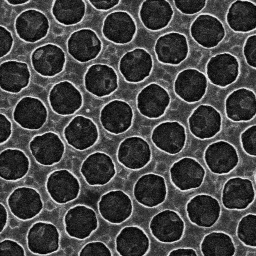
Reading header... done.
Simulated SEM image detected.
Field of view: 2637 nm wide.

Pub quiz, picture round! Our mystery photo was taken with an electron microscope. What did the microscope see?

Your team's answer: a regular array of holes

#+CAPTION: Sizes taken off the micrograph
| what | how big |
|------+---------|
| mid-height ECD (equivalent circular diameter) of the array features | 0.344 µm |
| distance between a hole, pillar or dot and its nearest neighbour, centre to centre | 394 nm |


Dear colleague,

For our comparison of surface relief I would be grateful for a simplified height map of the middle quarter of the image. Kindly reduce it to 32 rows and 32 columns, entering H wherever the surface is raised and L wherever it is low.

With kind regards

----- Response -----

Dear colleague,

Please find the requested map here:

HHHHHHHLLLLHHHLLLLLLLLHHHHHHHHHH
HHHHHHLLLLLLHHLLLLLLLLHHHHHHHHLL
HHHHHLLLLLLLLHLLLLLLLHHHHHHHHLLL
HHHHHLLLLLLLLHHLLLLLHHHHHHHHLLLL
LHHHHLLLLLLLLHHHLLLHHHHHHHHHLLLL
LLLHHLLLLLLLLHHHHHHHHLLLHHHLLLLL
LLLHHHLLLLLLLHHHHHHLLLLLLHHHLLLL
LLLLHHHLLLLLHHHHHHHLLLLLLLHHLLLL
LLLLLHHHHHHHHHHHHHLLLLLLLLLHHLLL
LLLLLHHHHHHLLLLHHHLLLLLLLLLHHHHL
LLLLHHHHHHLLLLLLHHLLLLLLLLHHHHHH
LLLLHHHHHLLLLLLLLHHLLLLLLHHHHHHH
LLHHHHHHHLLLLLLLLHHLLLLLLHHHHHHH
HHLLLLHHHLLLLLLLLHHHHLLHHHHHHHHL
HLLLLLLHHLLLLLLLLHHHHHHHHLLLHHHL
HLLLLLLLHHLLLLLLLHHHHHHLLLLLLLHL
LLLLLLLLHHHLLLLLHHHHHHLLLLLLLLHL
LLLLLLLLLHHHHLHHHHHHHHLLLLLLLLHH
LLLLLLLLLHHHHHHHLLLLHHLLLLLLLLHH
HLLLLLLLHHHHHHLLLLLLLHLLLLLLLLHH
HHLLLLLHHHHHHHLLLLLLLHHLLLLLLLHH
HHHHLHHHHHHHHLLLLLLLLLHHLLLLLHHH
HHHHHHHLLLLHHLLLLLLLLLHHHHHLHHHH
HHHHHHLLLLLLHLLLLLLLLLHHHHHHHHLL
HHHHHLLLLLLLHHLLLLLLLHHHHHHHLLLL
HHHHLLLLLLLLLHHLLLLLHHHHHHHLLLLL
LHHHLLLLLLLLLHHHHHHHHHHHHHHLLLLL
LLHHLLLLLLLLLHHHHHHHHLLHHHHLLLLL
LLLHHLLLLLLLHHHHHHHLLLLLLHHLLLLL
LLLLHHLLLLLHHHHHHHLLLLLLLHHLLLLL
LLLLHHHHHHHHHHHHHLLLLLLLLLHHLLLL
LLLLHHHHHHHHHHHHHLLLLLLLLLHHHLLH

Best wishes